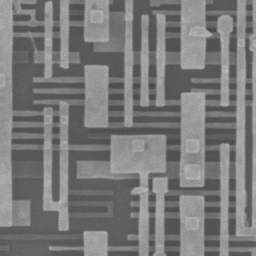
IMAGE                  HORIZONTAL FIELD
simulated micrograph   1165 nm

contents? wiring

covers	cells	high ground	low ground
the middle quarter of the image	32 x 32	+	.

+....++++......++..++..++....+++
.....++++++....++..++..++.......
.....++++++....++..++..++.......
.....++++++....++..++..++.......
.....++++++....++..++..++.......
.....++++++....++..++..++.......
.....++++++....++..++..++.......
.....++++++....++..++..++.....++
.....++++++....++..++..++....+++
.....++++++....++..++..++....+++
+....++++++....++..++..++....+++
+....++++++....++............+++
+....++++++....++............+++
+....++++++....++............+++
+....++++++....++............+++
+....++++++....++............+++
+............................+++
+............................+++
+...........+++++++++++++....+++
+...........+++++++++++++....+++
+...........+++++++++++++....+++
+...........+++++++++++++....+++
+...........+++++++++++++....+++
+...........+++++++++++++....+++
+...........+++++++++++++....+++
+...........+++++++++++++....+++
+...........+++++++++++++....+++
+..................++........+++
+..................++....+...+++
+..................++.++++...+++
+..................++.++++...+++
+................++++.++++......